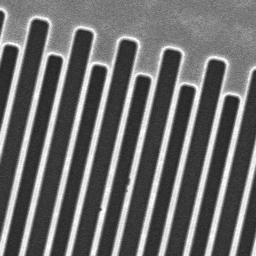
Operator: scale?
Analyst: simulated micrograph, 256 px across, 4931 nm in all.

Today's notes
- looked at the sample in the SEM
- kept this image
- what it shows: parallel lines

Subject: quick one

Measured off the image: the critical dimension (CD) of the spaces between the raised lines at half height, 343 nanometres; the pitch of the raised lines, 436 nm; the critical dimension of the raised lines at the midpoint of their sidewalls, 113 nanometres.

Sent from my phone